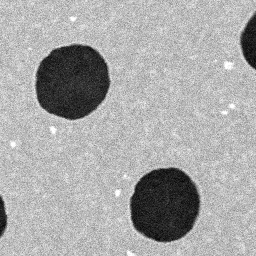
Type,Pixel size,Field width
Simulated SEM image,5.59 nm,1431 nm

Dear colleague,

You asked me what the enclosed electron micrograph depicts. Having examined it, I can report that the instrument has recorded holes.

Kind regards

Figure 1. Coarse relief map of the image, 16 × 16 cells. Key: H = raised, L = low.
HHHHHHHHHHHHHHHH
HHHHHHHHHHHHHHHL
HHHHHHHHHHHHHHHL
HHHLLLHHHHHHHHHL
HHLLLLLHHHHHHHHH
HHLLLLLHHHHHHHHH
HHHLLLHHHHHHHHHH
HHHHHHHHHHHHHHHH
HHHHHHHHHHHHHHHH
HHHHHHHHHHHHHHHH
HHHHHHHHHHHHHHHH
HHHHHHHHHLLLHHHH
HHHHHHHHLLLLHHHH
HHHHHHHHLLLLHHHH
HHHHHHHHHLLLHHHH
HHHHHHHHHHHHHHHH